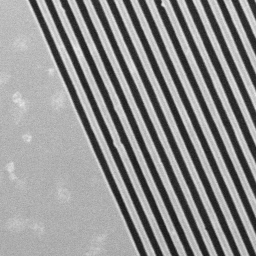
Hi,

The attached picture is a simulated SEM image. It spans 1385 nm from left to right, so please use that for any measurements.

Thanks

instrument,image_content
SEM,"parallel lines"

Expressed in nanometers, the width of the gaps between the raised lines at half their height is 38.5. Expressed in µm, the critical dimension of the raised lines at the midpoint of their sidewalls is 0.0379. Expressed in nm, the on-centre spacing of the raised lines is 77.3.